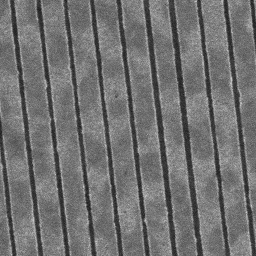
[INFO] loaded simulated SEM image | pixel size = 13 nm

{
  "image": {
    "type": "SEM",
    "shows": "parallel lines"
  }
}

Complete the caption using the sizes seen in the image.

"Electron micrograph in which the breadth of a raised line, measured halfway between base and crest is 276 nanometres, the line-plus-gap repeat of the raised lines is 0.345 µm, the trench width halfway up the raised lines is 0.0645 um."